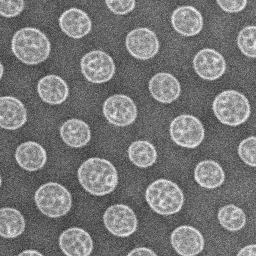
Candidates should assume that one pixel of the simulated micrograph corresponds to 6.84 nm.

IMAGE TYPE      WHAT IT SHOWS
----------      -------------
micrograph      a regular array of raised bodies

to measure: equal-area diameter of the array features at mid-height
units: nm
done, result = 205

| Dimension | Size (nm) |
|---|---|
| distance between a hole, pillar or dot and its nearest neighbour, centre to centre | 333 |